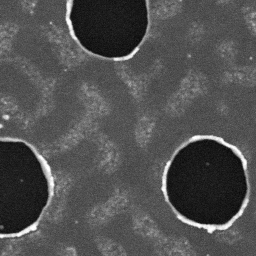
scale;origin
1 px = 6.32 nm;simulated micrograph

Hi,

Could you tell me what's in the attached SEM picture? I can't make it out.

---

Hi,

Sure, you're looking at holes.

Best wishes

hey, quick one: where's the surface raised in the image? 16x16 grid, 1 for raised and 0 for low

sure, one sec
1111000001111111
1111000001111111
1111100001111111
1111110011111111
1111111111111111
1111111111111111
1111111111111111
1111111111111111
1111111111111111
0011111111100001
0001111111100001
0001111111000001
0001111111100001
0011111111100001
0111111111111111
1111111111111111